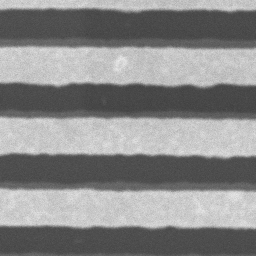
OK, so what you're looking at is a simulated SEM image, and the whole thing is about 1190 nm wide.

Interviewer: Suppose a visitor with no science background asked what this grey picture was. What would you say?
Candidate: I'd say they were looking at lines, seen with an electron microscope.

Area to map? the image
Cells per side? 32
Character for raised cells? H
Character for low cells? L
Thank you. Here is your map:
HHHHHHHHHHHHHHHHHHHHHHHHHHHHHHHH
LLLLLLLLLLLLLLLLLLLLLLLLLLLLLLLL
LLLLLLLLLLLLLLLLLLLLLLLLLLLLLLLL
LLLLLLLLLLLLLLLLLLLLLLLLLLLLLLLL
LLLLLLLLLLLLLLLLLLLLLLLLLLLLLLLL
HHHHHHHHHHHHHHHHHHHHHHHHHHHHHHHH
HHHHHHHHHHHHHHHHHHHHHHHHHHHHHHHH
HHHHHHHHHHHHHHHHHHHHHHHHHHHHHHHH
HHHHHHHHHHHHHHHHHHHHHHHHHHHHHHHH
HHHHHHHHHHHHHHHHHHHHHHHHHHHHHHHH
LLLLHHHHHLLLLLHHLLHHHHHHHHHLLHHH
LLLLLLLLLLLLLLLLLLLLLLLLLLLLLLLL
LLLLLLLLLLLLLLLLLLLLLLLLLLLLLLLL
LLLLLLLLLLLLLLLLLLLLLLLLLLLLLLLL
HHHHHHHHHHHHHHHHHHHHHHHHHHHHHHHH
HHHHHHHHHHHHHHHHHHHHHHHHHHHHHHHH
HHHHHHHHHHHHHHHHHHHHHHHHHHHHHHHH
HHHHHHHHHHHHHHHHHHHHHHHHHHHHHHHH
HHHHHHHHHHHHHHHHHHHHHHHHHHHHHHHH
LLLLLLLLLLLLLLLLLLLLLLLLLHHHHLHL
LLLLLLLLLLLLLLLLLLLLLLLLLLLLLLLL
LLLLLLLLLLLLLLLLLLLLLLLLLLLLLLLL
LLLLLLLLLLLLLLLLLLLLLLLLLLLLLLLL
HHHHHHHHHHHHHHHHHHHHHHHHHHHHHHHH
HHHHHHHHHHHHHHHHHHHHHHHHHHHHHHHH
HHHHHHHHHHHHHHHHHHHHHHHHHHHHHHHH
HHHHHHHHHHHHHHHHHHHHHHHHHHHHHHHH
HHHHHHHHHHHHHHHHHHHHHHHHHHHHHHHH
LLLLLLLLLLHLLLLLLLHHLLLLLLLLLHHH
LLLLLLLLLLLLLLLLLLLLLLLLLLLLLLLL
LLLLLLLLLLLLLLLLLLLLLLLLLLLLLLLL
LLLLLLLLLLLLLLLLLLLLLLLLLLLLLLLL